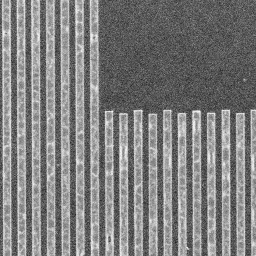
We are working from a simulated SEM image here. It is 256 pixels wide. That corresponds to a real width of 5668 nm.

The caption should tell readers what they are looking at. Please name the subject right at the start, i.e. parallel lines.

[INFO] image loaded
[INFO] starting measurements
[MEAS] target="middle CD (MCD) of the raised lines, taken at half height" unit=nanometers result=163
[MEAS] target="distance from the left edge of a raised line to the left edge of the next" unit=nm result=324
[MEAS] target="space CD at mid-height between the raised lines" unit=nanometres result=163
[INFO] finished